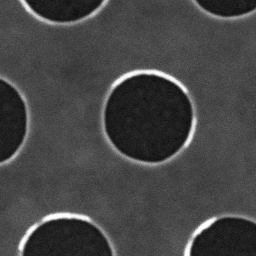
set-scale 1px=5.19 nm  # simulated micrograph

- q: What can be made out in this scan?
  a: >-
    holes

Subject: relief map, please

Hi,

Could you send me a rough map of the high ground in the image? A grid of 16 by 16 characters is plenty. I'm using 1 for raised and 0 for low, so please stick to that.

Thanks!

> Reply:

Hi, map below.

1100001111111000
1111111111111111
1111111111111111
1111111111111111
1111111111111111
0111111000011111
0111111000001111
0011110000001111
0011111000001111
0111111100011111
1111111111111111
1111111111111111
1111111111111111
1111111111111111
1100001111111000
1000000111110000